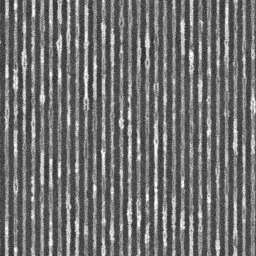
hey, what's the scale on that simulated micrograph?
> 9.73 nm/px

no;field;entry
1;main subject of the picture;parallel lines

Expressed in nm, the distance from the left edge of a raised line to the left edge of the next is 85.5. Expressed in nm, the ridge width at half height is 25.6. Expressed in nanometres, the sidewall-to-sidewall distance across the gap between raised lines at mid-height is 58.4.